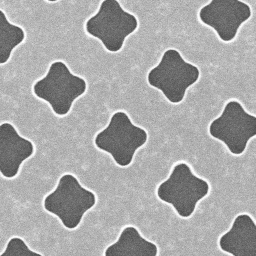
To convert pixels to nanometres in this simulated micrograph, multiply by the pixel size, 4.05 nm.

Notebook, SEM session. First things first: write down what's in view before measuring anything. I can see holes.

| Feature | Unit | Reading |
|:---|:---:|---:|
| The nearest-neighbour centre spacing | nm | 325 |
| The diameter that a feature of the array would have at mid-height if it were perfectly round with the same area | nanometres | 185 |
